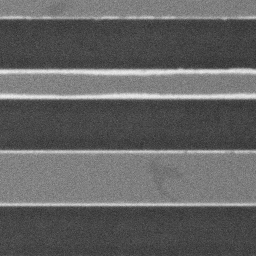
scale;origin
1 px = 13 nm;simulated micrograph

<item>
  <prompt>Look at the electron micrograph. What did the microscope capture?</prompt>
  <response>lines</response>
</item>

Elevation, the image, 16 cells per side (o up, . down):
oooooooooooooooo
................
................
................
oooooooooooooooo
oooooooooooooooo
................
................
................
oooooooooooooooo
oooooooooooooooo
oooooooooooooooo
oooooooooooooooo
................
................
................